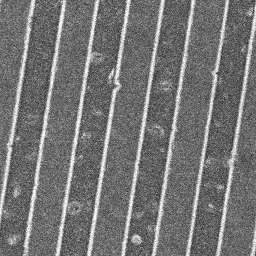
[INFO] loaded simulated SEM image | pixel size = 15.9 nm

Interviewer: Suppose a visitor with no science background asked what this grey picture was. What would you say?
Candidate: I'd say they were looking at one or a few lines or trenches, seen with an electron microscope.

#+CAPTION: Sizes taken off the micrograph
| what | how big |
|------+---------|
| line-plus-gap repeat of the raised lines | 1.02 µm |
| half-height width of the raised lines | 0.542 microns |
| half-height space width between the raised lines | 474 nm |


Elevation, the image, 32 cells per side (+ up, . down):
++++....++++....++++....++++....
++++....++++....++++....++++....
++++....++++....++++....++++....
++++....++++....++++....++++....
+++....+++++...+++++....++++...+
+++....++++....+++++...+++++...+
+++....++++....++++....++++....+
+++....++++....++++....++++....+
+++....++++....++++....++++....+
+++....++++....++++....++++....+
+++...+++++....++++....++++....+
++....++++....+++++...+++++...++
++....++++....++++....+++++...++
++....++++....++++....++++....++
++....++++....++++....++++....++
++....++++....++++....++++....++
++...+++++....++++....++++....++
+....+++++...+++++...+++++...+++
+....++++....+++++...+++++...+++
+....++++....++++....++++....+++
+....++++....++++....++++....+++
+....++++....++++....++++....+++
+....++++....++++....++++....+++
+...+++++...+++++....++++...++++
....++++....+++++...+++++...++++
....++++....++++....+++++...++++
....++++....++++....++++....++++
....++++....++++....++++....++++
....++++....++++....++++....++++
...+++++...+++++....++++....++++
...++++....+++++...+++++...+++++
...++++....++++....+++++...+++++